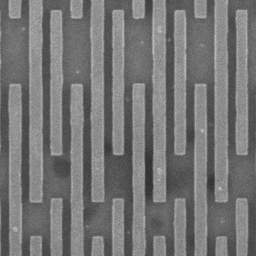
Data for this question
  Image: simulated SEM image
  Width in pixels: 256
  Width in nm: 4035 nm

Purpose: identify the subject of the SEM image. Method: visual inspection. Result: wiring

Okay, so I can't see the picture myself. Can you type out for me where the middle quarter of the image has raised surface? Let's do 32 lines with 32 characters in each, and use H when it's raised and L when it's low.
LLLLLLLHHHLLHHHLLLLLLLLHHLLLHHLL
LLLLLLLHHHLLHHHLLLLLLLHHHLLLHHLL
LLLLLLLHHHLLHHHLLLLLLLHHHLLLHHLL
LLLLLLLHHHLLHHHLLLLLLLHHHLLLHHLL
LLLLLLLHHHLLHHHLLLLLLLHHHLLLHHLL
LLHHLLLHHHLLHHHLLHHHLLHHHLLLHHLL
LLHHLLLHHHLLHHHLLHHHLLHHHLLLHHLL
LLHHLLLHHHLLHHHLLHHHLLHHHLLLHHLL
LLHHLLLHHHLLHHHLLHHHLLHHHLLLHHLL
LLHHLLLHHHLLHHHLLHHHLLHHHLLLHHLL
LLHHHLLHHHLLHHHLLHHHLLHHHLLLHHLL
LLHHHLLHHHLLHHHLLHHHLLHHHLLLHHLL
LLHHHLLHHHLLHHHLLHHHLLHHHLLLHHLL
LLHHHLLHHHLLHHHLLHHHLLHHHLLLHHLL
LLHHHLLHHHLLHHHLLHHHLLHHHLLLHHLL
LLHHHLLHHHLLHHHLLHHHLLLHHLLLHHLL
LLHHLLLHHHLLHHHLLHHHLLHHHLLLHHLL
LLHHLLLHHHLLHHHLLHHHLLHHHLLLHHLL
LLHHLLLHHHLLHHHLLHHHLLLHHLLLHHLL
LLHHLLLHHHLLHHHLLHHHLLLHHLLLHHLL
LLHHLLLHHHLLHHHLLHHHLLLHHLLLHHLL
LLHHLLLHHHLLHHHLLHHHLLLHHLLLHHLL
LLHHLLLHHHLLLHHLLHHHLLHHHLLLHHLL
LLHHLLLHHHLLLLLLLHHHLLHHHLLLLLLL
LLHHLLLHHHLLLLLLLHHHLLHHHLLLLLLL
LLHHLLLHHHLLLLLLLHHHLLHHHLLLLLLL
LLHHLLLHHHLLLLLLLHHHLLHHHLLLLLLL
LLHHLLLHHHLLLLLLLHHHLLHHHLLLLLLL
LLHHLLLHHHLLLLLLLHHHLLHHHLLLLLLL
LLHHLLLHHHLLLLLLLHHHLLHHHLLLLLLL
LLHHLLLHHHLLLLLLLHHHLLLHHLLLLLLL
LLHHLLLHHHLLLLLLLHHHLLHHHLLLLLLL